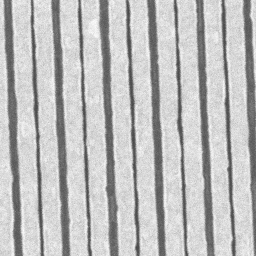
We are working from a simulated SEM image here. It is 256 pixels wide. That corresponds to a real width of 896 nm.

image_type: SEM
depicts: parallel lines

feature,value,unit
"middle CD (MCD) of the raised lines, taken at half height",0.0621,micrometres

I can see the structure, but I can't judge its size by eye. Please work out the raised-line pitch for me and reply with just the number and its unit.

82.8 nm